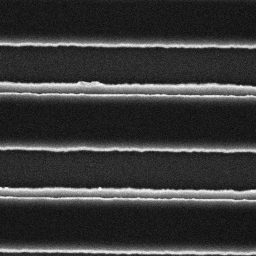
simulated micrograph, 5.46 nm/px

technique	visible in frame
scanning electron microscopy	lines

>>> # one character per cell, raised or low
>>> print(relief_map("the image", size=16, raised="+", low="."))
++++++++++++++++
++++++++++++++++
++++++++++++++++
................
................
++++++++++++++++
++++++++++++++++
++++++++++++++++
++++++++++++++++
................
................
................
++++++++++++++++
++++++++++++++++
++++++++++++++++
++++++++++++++++